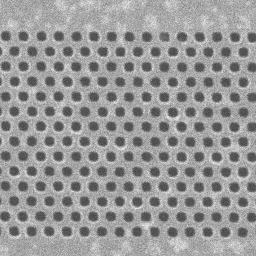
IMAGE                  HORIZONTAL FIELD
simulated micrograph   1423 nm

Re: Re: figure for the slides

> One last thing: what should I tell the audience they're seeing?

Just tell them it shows a regular array of holes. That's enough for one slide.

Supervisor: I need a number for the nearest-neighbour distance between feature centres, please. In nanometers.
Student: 95.7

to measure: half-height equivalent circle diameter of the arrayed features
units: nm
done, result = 60.9